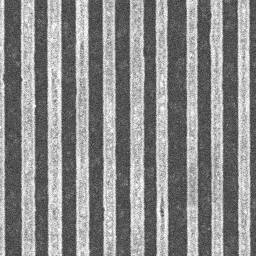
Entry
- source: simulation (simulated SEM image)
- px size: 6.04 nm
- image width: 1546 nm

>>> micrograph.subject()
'parallel lines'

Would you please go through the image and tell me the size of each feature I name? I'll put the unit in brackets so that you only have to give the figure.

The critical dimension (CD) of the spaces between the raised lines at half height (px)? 15.4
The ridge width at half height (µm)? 0.0642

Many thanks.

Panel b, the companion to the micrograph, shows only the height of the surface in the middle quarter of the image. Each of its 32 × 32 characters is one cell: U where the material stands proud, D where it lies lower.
DDDUUUDDDDUUUDDDDUUUDDDUUUDDDDDU
DDDUDUDDDDUUUDDDDUUUDDDUUUDDDDDU
DDDUDUDDDDUUUDDDDUUUDDDUUUDDDDDU
DDDUUUDDDDUUUDDDDUUUDDDUUUDDDDDU
DDDUUUDDDDUUUDDDDUUUDDDUUUDDDDDU
DDDUUUDDDDUUUDDDDUUUDDDUUUDDDDDU
DDDUUUDDDDUUUDDDDUUUDDDUUUDDDDDU
DDDUUUDDDDUUUDDDDUUUDDDUUUDDDDDU
DDDUUUDDDDUUUDDDDUUUDDDUUUDDDDDU
DDDUUUDDDDUUUDDDDUUUDDDUUUDDDDDU
DDDUUUDDDDUUUDDDDUUUDDDUUUDDDDDU
DDDUUUDDDDUUUDDDDUUUDDDUUUDDDDDU
DDDUUUDDDDUUUDDDDUUUDDDUUUDDDDDU
DDDUUUDDDDUUUDDDDUUUDDDUUUDDDDDU
DDDUUUDDDDUUUDDDDUUUDDDUUUDDDDDU
DDDUUUDDDDUUUDDDDUUUDDDUUUDDDDDU
DDDUUUDDDDUUUDDDDUUUDDDUUUDDDDDU
DDDUUUDDDDUUUDDDDUUUDDDUUUDDDDDU
DDDUUUDDDDUUUDDDDUUUDDDUUUDDDDDU
DDDUUUDDDDUUUDDDDUUUDDDUUUDDDDDU
DDDUUUDDDDUUUDDDDUUUDDDUUUDDDDDU
DDDUUUDDDDUUUDDDDUUUDDDUUUDDDDDU
DDDUUUDDDDUUUDDDDUUUDDDUUUDDDDDU
DDDUDUDDDDUUUDDDDUUUDDDUUUDDDDDU
DDDUDUDDDDUUUDDDDUUUDDDUUUDDDDDU
DDDUUUDDDDUUUDDDDUUUDDDUUUDDDDDU
DDDUUUDDDDUUUDDDDUUUDDDUUUDDDDDU
DDDUUUDDDDUUUDDDDUUUDDDUUUDDDDDU
DDDUUUDDDDUUUDDDDUUUDDDUUUDDDDDU
DDDUUUDDDDUUUDDDDUUUDDDUUUDDDDDU
DDDUUUDDDDUUUDDDDUUUDDDUUUDDDDDU
DDDUUUDDDDUUUDDDDUUUDDDUUUDDDDDU